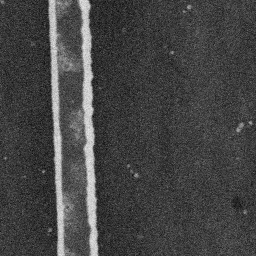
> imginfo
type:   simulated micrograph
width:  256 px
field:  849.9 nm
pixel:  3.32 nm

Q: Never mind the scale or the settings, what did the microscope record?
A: one or a few lines or trenches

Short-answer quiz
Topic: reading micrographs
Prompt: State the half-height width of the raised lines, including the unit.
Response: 110 nanometers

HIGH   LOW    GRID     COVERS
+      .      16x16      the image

...++...........
...++...........
...++...........
...++...........
...+++..........
...++...........
...++...........
...+++..........
....++..........
....++..........
....++..........
....++..........
....++..........
....++..........
....++..........
....++..........